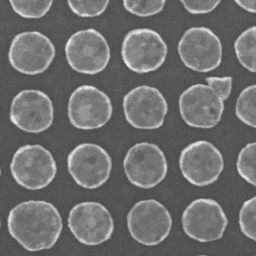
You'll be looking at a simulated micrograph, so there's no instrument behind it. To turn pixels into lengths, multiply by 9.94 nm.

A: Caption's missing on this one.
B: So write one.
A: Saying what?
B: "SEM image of a regular array of raised bodies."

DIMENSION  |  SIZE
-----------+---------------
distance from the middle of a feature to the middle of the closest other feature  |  554 nm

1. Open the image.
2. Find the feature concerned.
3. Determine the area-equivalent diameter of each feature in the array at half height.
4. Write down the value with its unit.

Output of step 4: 0.428 microns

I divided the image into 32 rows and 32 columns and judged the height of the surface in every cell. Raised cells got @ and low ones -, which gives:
-@@@@@---@@@@---@@@@---@@@@---@@
--@@@@---@@@@---@@@@----@@------
--------------------------------
------------------------@-------
--@@@----@@@@---@@@@---@@@@---@@
--@@@@--@@@@@--@@@@@@-@@@@@@-@@@
-@@@@@@-@@@@@@-@@@@@@-@@@@@@--@@
-@@@@@---@@@@@--@@@@---@@@@@--@@
--@@@@---@@@@---@@@-----@@@----@
--------------------------------
--------------------------@@@---
---@@----@@@@---@@@@---@@@@@@-@@
--@@@@---@@@@@--@@@@@-@@@@@@--@@
-@@@@@---@@@@@--@@@@@-@@@@@@--@@
-@@@@@@--@@@@@--@@@@@--@@@@@--@@
--@@@@---@@@@---@@@@----@@@----@
----@---------------------------
--------------------------------
---@@-----@@@----@@@----@@@----@
--@@@@---@@@@---@@@@@--@@@@@--@@
--@@@@@--@@@@@--@@@@@-@@@@@@--@@
--@@@@@--@@@@@--@@@@@--@@@@---@@
--@@@@---@@@@---@@@@----@@@----@
----@---------------------------
--------------------------------
---@@@----@@-----@@@----@@@----@
-@@@@@@--@@@@---@@@@@--@@@@@--@@
-@@@@@@@-@@@@@--@@@@@--@@@@@--@@
-@@@@@@@-@@@@@--@@@@@--@@@@@--@@
--@@@@@--@@@@@---@@@@---@@@@---@
---@@@@----@------@-------------
--------------------------------